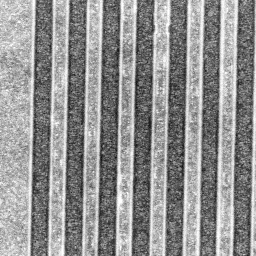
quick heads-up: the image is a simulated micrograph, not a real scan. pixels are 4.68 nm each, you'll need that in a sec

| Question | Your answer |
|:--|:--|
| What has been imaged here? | parallel lines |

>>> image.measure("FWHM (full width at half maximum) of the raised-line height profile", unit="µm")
0.0666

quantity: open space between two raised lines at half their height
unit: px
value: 19.7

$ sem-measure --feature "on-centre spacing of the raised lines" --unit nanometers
158